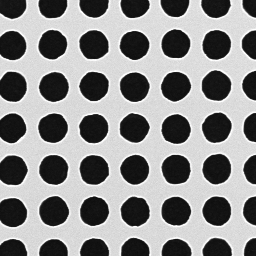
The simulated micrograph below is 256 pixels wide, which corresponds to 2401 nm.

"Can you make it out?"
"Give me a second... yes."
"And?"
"a regular array of holes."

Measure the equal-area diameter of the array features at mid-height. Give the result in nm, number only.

275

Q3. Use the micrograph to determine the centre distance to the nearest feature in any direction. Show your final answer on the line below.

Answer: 0.381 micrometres